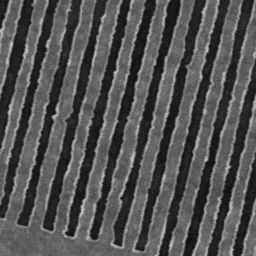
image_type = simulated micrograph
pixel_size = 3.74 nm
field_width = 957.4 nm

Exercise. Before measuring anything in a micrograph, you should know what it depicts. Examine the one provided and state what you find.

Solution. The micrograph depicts parallel lines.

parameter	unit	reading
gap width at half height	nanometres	38.6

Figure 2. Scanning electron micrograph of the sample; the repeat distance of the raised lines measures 88.7 nanometres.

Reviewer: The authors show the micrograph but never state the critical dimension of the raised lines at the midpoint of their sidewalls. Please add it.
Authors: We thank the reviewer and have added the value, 49.1 nanometers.